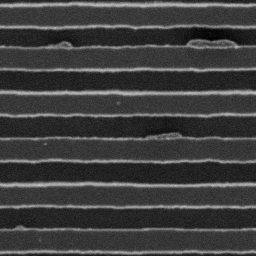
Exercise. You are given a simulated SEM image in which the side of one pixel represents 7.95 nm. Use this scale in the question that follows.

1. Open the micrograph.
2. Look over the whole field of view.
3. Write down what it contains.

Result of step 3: lines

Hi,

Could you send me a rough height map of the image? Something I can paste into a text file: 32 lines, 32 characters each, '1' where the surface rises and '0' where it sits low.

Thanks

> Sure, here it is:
00000000000000000000000000000000
11111111111111111111111111111111
11111111111111111111111111111111
00000111000000000000000000000000
00000000000000000000000000000000
00000001100000000000000111111000
11111111111111111111111111111111
11111111111111111111111111111111
11111111111111111111111111111111
00000000000000000000000000000000
00000000000000000000000000000000
00000000000000000000000000000000
11111111111111111111111111111111
11111111111111111111111111111111
01110000100111110000000001000000
00000000000000000000000000000000
00000000000000000000000000000000
11111111111111111111111111111111
11111111111111111111111111111111
11111111111111111111111111111111
00000000000000000000000000000000
00000000000000000000000000000000
00000000000000000000000000000000
11111111111111111111111111111111
11111111111111111111111111111111
11111111111111111111111111111111
00000000000000000000000000000000
00000000000000000000000000000000
00100000000000000000000000000000
11111111111111111111111111111111
11111111111111111111111111111111
11000000000000111100000001110110